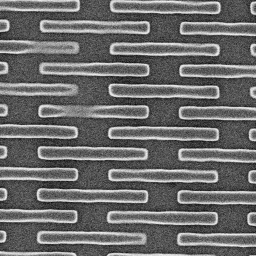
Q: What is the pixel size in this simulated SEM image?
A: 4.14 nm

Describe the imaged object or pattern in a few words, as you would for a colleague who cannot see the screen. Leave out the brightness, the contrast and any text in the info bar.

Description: groups of lines, slits or small figures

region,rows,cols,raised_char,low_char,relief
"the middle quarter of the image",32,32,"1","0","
11111111111111111111100000000011
11111111111111111111100000000111
00000111111111111111100000000111
00000000000000000000000000000000
00000000000000000000000000000000
11000000000111111111111111111000
11100000000111111111111111111111
00000000000011111111111111111111
00000000000000000000000000000000
00000000000000000000000000000000
00000000000000000000000000000000
11111111111111111111100000000111
10000111111111111111100000000111
00000000000000000000000000000111
00000000000000000000000000000000
00000000000000000000000000000000
11100000000111111111111111111111
11100000000111111111111111111111
00000000000000000000000011111111
00000000000000000000000000000000
00000000000000000000000000000000
11111111111111111111000000000111
11111111111111111111100000000111
11111111111111111111000000000111
00000000000000000000000000000000
00000000000000000000000000000000
11100000000000000000000110000000
11100000000111111111111111111111
11100000000111111111111111111111
00000000000000000000000000000000
00000000000000000000000000000000
01100000000000000000000000000000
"